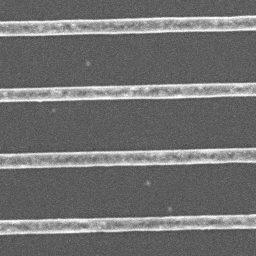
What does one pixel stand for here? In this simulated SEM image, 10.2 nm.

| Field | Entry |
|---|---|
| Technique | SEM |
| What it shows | one or a few lines or trenches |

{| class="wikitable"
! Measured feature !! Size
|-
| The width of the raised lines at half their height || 0.137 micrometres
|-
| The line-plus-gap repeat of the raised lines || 0.677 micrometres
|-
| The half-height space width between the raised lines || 539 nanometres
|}